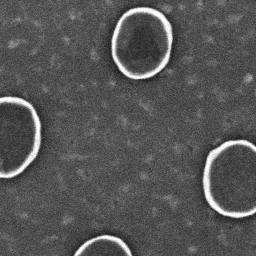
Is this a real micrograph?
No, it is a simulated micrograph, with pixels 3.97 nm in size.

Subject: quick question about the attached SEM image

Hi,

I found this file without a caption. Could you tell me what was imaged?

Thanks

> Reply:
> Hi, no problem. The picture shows raised bodies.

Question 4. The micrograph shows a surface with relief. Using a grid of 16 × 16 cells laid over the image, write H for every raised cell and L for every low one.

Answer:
LLLLLLLLLLLLLLLL
LLLLLLLHHHLLLLLL
LLLLLLLHHHHLLLLL
LLLLLLLHHHLLLLLL
LLLLLLLLHHLLLLLL
LLLLLLLLLLLLLLLL
HHLLLLLLLLLLLLLL
HHLLLLLLLLLLLLLL
HHLLLLLLLLLLLLLL
HHLLLLLLLLLLLLHH
HLLLLLLLLLLLLHHH
LLLLLLLLLLLLLHHH
LLLLLLLLLLLLLHHH
LLLLLLLLLLLLLLLL
LLLLLLLLLLLLLLLL
LLLLLHHHLLLLLLLL